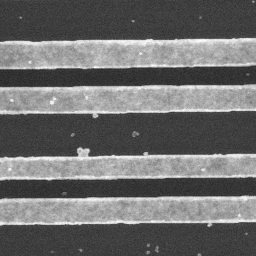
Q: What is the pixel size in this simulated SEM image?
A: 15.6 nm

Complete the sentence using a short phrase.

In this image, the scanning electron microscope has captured lines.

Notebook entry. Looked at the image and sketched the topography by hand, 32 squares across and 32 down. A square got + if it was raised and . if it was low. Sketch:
................................
................................
................................
................................
................................
++++++++++++++++++++++++++++++++
++++++++++++++++++++++++++++++++
++++++++++++++++++++++++++++++++
++++............................
................................
................................
++++++++++++++++++++++++++++++++
++++++++++++++++++++++++++++++++
++++++++++++++++++++++++++++++++
................................
................................
................................
................................
................................
..................++++++++++++++
++++++++++++++++++++++++++++++++
++++++++++++++++++++++++++++++++
................................
................................
................................
++++++++++++++++++++++++++++++++
++++++++++++++++++++++++++++++++
++++++++++++++++++++++++++++++++
................................
................................
................................
................................